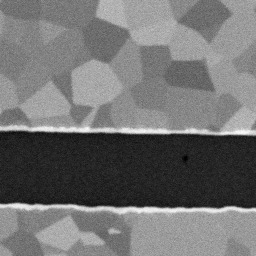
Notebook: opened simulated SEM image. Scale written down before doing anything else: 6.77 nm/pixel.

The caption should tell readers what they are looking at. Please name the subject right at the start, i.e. one or a few lines or trenches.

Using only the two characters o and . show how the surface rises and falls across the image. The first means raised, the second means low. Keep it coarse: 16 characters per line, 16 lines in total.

oooooooooooooooo
oooooooooooooooo
oooooooooooooooo
oooooooooooooooo
oooooooooooooooo
oooooooooooooooo
oooooooooooooooo
oooooooooooooooo
................
................
................
................
................
oooooooooooooooo
oooooooooooooooo
oooooooooooooooo